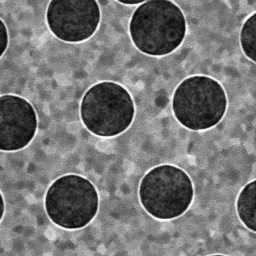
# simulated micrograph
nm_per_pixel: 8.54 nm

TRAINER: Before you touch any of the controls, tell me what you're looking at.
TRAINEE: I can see holes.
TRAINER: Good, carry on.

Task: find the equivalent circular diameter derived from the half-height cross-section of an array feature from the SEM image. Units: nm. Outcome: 465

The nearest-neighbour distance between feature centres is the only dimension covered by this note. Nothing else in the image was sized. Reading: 0.802 µm